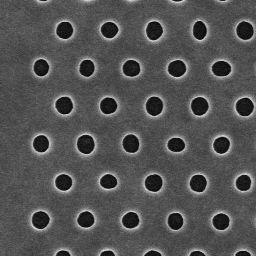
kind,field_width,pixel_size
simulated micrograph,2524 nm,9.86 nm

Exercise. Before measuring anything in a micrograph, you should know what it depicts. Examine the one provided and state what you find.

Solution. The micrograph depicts a regular array of holes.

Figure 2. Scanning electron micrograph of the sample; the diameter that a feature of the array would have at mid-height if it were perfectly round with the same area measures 170 nm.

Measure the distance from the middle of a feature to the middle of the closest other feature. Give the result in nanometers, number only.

434